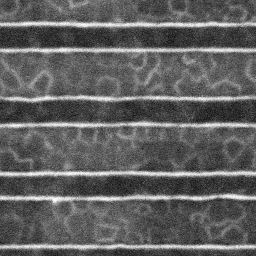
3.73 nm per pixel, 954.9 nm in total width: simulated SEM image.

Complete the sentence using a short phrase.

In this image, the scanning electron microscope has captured one or a few lines or trenches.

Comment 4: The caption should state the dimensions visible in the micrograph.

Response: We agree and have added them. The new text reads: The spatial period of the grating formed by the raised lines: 0.277 µm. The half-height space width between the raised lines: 177 nm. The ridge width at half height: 26.9 pixels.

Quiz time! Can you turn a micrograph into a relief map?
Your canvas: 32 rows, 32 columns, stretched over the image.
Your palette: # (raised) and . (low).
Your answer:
................................
................................
................................
################################
################################
################################
................................
................................
................................
................................
................................
................................
################################
################################
################################
################################
................................
................................
................................
................................
................................
................................
################################
################################
################################
................................
................................
................................
................................
................................
................................
################################